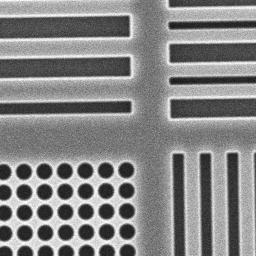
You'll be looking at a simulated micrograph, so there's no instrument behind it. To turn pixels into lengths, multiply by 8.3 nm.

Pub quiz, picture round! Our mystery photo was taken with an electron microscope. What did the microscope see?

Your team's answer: groups of lines, slits or small figures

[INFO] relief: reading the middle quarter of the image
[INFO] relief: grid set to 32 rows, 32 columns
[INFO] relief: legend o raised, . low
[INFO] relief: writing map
.................ooooooooooooooo
.................ooooooooooooooo
.................ooooooooooooooo
..oooooooooooooooooooooooo......
oooooooooooooooooooooooooo......
oooooooooooooooooooooooooooooooo
oooooooooooooooooooooooooooooooo
oooooooooooooooooooooooooooooooo
oooooooooooooooooooooooooooooooo
.................ooooooooo......
.................ooooooooo......
.................ooooooooo......
...........ooooooooooooooo......
ooooooooooooooooooooooooooo.....
oooooooooooooooooooooooooooooooo
oooooooooooooooooooooooooooooooo
oooooooooooooooooooooooooooooooo
oooooooooooooooooooooooooooooooo
oooooooooooooooooooooooooooooooo
oooooooooooooooooooooooooooooooo
oooooooooooooooooooooooooooooooo
oooooooooooooooooooooooooooooooo
oooooooooooooooooooooooooooo..oo
ooooooooooooooooooooooooooo...oo
ooooooooooooooo.ooooooooooo...oo
..oo...oo...oo...oooooooooo...oo
..o...............ooooooooo...oo
..o....o....oo...oooooooooo...oo
.ooo..oooo.oooo.ooooooooooo...oo
ooooooooooooooooooooooooooo...oo
..oo...oo...oo...oooooooooo...oo
..o...............ooooooooo...oo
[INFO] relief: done